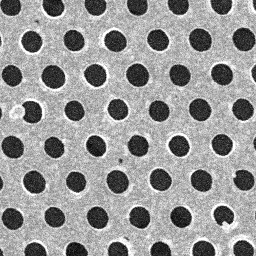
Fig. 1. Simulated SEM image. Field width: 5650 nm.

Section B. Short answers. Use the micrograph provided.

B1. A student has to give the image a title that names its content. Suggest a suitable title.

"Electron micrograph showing a regular array of holes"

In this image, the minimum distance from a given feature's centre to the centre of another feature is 885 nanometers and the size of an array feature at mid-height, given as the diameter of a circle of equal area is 494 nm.